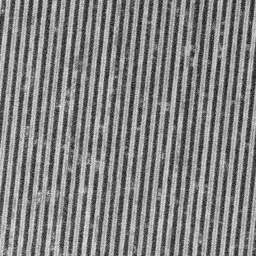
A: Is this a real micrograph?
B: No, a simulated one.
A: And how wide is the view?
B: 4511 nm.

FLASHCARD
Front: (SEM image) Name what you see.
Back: parallel lines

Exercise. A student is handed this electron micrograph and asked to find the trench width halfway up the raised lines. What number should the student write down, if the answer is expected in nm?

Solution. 116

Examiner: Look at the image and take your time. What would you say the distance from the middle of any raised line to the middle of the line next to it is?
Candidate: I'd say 9.17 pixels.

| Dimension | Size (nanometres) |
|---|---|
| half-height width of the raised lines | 50.4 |